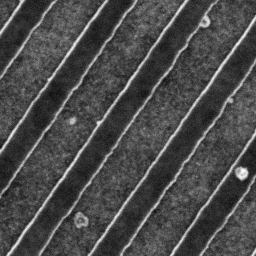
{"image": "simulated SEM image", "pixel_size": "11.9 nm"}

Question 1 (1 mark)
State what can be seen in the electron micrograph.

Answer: lines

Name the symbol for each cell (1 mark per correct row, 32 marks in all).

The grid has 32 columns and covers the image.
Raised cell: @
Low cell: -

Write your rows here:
--@@@@@------@@@@------@@@@-----
--@@@@------@@@@------@@@@------
-@@@@------@@@@------@@@@@------
@@@@-------@@@@------@@@@------@
@@@@------@@@@------@@@@------@@
@@@------@@@@------@@@@-------@@
@@-------@@@@------@@@@------@@@
@@------@@@@------@@@@------@@@@
@------@@@@------@@@@------@@@@@
-------@@@@------@@@@------@@@@-
------@@@@------@@@@------@@@@--
-----@@@@------@@@@------@@@@---
----@@@@-------@@@-------@@@@---
----@@@@------@@@@------@@@@----
---@@@@------@@@@------@@@@-----
--@@@@------@@@@-------@@@@-----
--@@@@------@@@@------@@@@------
-@@@@------@@@@------@@@@------@
@@@@------@@@@-------@@@@------@
@@@@------@@@@------@@@@------@@
@@@------@@@@------@@@@------@@@
@@------@@@@------@@@@-------@@@
@@------@@@-------@@@@------@@@@
@------@@@@------@@@@------@@@@-
------@@@@------@@@@------@@@@@-
-----@@@@-------@@@@------@@@@--
-----@@@@------@@@@------@@@@---
----@@@@------@@@@------@@@@----
---@@@@------@@@@@------@@@@----
---@@@@------@@@@------@@@@-----
--@@@@------@@@@------@@@@------
-@@@@------@@@@-------@@@-------